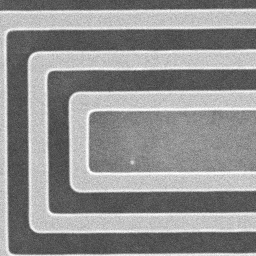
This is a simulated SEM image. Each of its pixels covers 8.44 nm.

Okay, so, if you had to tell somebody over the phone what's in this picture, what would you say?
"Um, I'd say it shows groups of lines, slits or small figures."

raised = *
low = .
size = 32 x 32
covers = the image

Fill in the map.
................................
********************************
********************************
*****************************...
*...............................
*...............................
*......*************************
*...****************************
*...****************************
*...**..........................
*...**..........................
*...**.............*************
*...**...***********************
*...**...***********************
*...**...**.....................
*...**...**.....................
*...**...**.....................
*...**...**.....................
*...**...**.....................
*...**...**.....................
*...**...**.....................
*...**...***....................
*...**...***********************
*...**...***********************
*...**..........................
*...**..........................
*...**..........................
*...****************************
*...****************************
*...............................
*...............................
*...............................